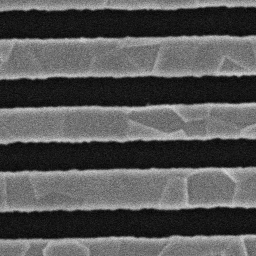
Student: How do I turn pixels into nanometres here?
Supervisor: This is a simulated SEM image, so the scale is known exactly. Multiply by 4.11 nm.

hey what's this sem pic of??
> lines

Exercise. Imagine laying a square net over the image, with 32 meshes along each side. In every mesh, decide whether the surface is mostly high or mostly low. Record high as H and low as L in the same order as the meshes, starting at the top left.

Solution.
HHHHHHHHHHHHHHHHHHHHHHHHHHHHHHHH
LLLLLLLLLLLLLLLLLLLLLLLLLLLLLLLL
LLLLLLLLLLLLLLLLLLLLLLLLLLLLLLLL
LLLLLLLLLLLLLLLLLLLLLLLLLLLLLLLL
LLLLLLLLLLLLLLLLLLLLLLLLLLLLLLLL
HHHHHHHHHHHHHHHHHHHHHHHHHHHHHHHH
HHHHHHHHHHHHHHHHHHHHHHHHHHHHHHHH
HHHHHHHHHHHHHHHHHHHHHHHHHHHHHHHH
HHHHHHHHHHHHHHHHHHHHHHHHHHHHHHHH
HHHHHHHHHHHHHHHHHHLHHHHLHLLLLLLL
LLLLLLLLLLLLLLLLLLLLLLLLLLLLLLLL
LLLLLLLLLLLLLLLLLLLLLLLLLLLLLLLL
LLLLLLLLLLLLLLLLLLLLLLLLLLLLLLLL
LLLLLHHHHHHHHHHHHHHHHHHHHHHHHHHH
HHHHHHHHHHHHHHHHHHHHHHHHHHHHHHHH
HHHHHHHHHHHHHHHHHHHHHHHHHHHHHHHH
HHHHHHHHHHHHHHHHHHHHHHHHHHHHHHHH
HHHHHHHHHHHHHHHHHLHLLLLLLLLLLLLL
LLLLLLLLLLLLLLLLLLLLLLLLLLLLLLLL
LLLLLLLLLLLLLLLLLLLLLLLLLLLLLLLL
LLLLLLLLLLLLLLLLLLLLLLLLLLLLLLLL
LLHHHLHHHHHHHHHHHHHHHHHHHHHHHHHH
HHHHHHHHHHHHHHHHHHHHHHHHHHHHHHHH
HHHHHHHHHHHHHHHHHHHHHHHHHHHHHHHH
HHHHHHHHHHHHHHHHHHHHHHHHHHHHHHHH
HHHHHHHHHHHHHHHHHHHHHHHHHHHHHHHH
LLLLLLLLLLLLLLLLLLLLLLLLLLLLLLLL
LLLLLLLLLLLLLLLLLLLLLLLLLLLLLLLL
LLLLLLLLLLLLLLLLLLLLLLLLLLLLLLLL
LLLLLLLLLLLLLLLLLLLLLLLLLLLLLLHH
HHHHHHHHHHHHHHHHHHHHHHHHHHHHHHHH
HHHHHHHHHHHHHHHHHHHHHHHHHHHHHHHH